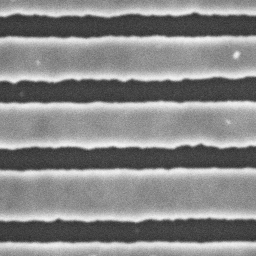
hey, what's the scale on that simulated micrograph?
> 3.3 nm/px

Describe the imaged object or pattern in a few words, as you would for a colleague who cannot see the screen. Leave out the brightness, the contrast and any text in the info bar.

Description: lines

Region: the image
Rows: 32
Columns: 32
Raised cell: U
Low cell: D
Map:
UUUUUUUUUUUUUUUUUUUUUUUUUUUUUUUU
UUUUUUUUUUUUUUUUUUUUUUUUUUUUUUUU
DDDDDDDDDDDDDDDDDDDDDDDDDDDDDDDD
DDDDDDDDDDDDDDDDDDDDDDDDDDDDDDDD
DDDDDDDDDDDDDDDDDDDDDDDDDDDDDDDD
UUUUUUUUUUUUUUUUUUUUUUUUUUUUUUUU
UUUUUUUUUUUUUUUUUUUUUUUUUUUUUUUU
UUUUUUUUUUUUUUUUUUUUUUUUUUUUUUUU
UUUUUUUUUUUUUUUUUUUUUUUUUUUUUUUU
UUUUUUUUUUUUUUUUUUUUUUUUUUUUUUUD
DDDDDDDDDDDDDDDDDDDDDDDDDDDDDDDD
DDDDDDDDDDDDDDDDDDDDDDDDDDDDDDDD
DDDDDDDDDDDDDDDDDDDDDDDDDDDDDDDD
UUUUUUUUUUUUUUUUUUUUUUUUUUUUUUUU
UUUUUUUUUUUUUUUUUUUUUUUUUUUUUUUU
UUUUUUUUUUUUUUUUUUUUUUUUUUUUUUUU
UUUUUUUUUUUUUUUUUUUUUUUUUUUUUUUU
UUUUUUUUUUUUUUUUUUUUUUUUUUUUUUUU
DUDDDDDDDDDUDDDDDDDDDUDDDDDDDDDD
DDDDDDDDDDDDDDDDDDDDDDDDDDDDDDDD
DDDDDDDDDDDDDDDDDDDDDDDDDDDDDDDD
UUUUUUUUUUUUUUUUUUUUUUUUUUUUUUUU
UUUUUUUUUUUUUUUUUUUUUUUUUUUUUUUU
UUUUUUUUUUUUUUUUUUUUUUUUUUUUUUUU
UUUUUUUUUUUUUUUUUUUUUUUUUUUUUUUU
UUUUUUUUUUUUUUUUUUUUUUUUUUUUUUUU
UUUUUUUUUUUUUUUUUUUUUUUUUUUUUUUU
UUUUUUUDUUUUUUUUUUDDDDDDDDDDDDDD
DDDDDDDDDDDDDDDDDDDDDDDDDDDDDDDD
DDDDDDDDDDDDDDDDDDDDDDDDDDDDDDDD
UUUUUUUUUUUUUUUUUUUUUUUUUUUUUUUU
UUUUUUUUUUUUUUUUUUUUUUUUUUUUUUUU